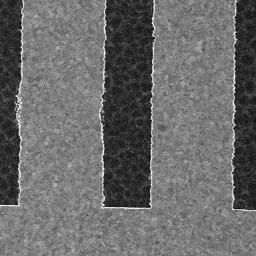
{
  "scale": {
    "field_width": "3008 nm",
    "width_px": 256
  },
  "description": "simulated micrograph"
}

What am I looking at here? one or a few lines or trenches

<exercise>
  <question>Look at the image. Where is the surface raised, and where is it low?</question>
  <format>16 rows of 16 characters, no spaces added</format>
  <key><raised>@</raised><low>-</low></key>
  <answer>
-@@@@@@---@@@@@-
-@@@@@@---@@@@@-
-@@@@@@---@@@@@-
-@@@@@@---@@@@@-
-@@@@@@---@@@@@-
-@@@@@----@@@@@-
-@@@@@---@@@@@@-
-@@@@@---@@@@@@-
-@@@@@---@@@@@@-
-@@@@@---@@@@@@-
-@@@@@---@@@@@@-
-@@@@@---@@@@@@-
-@@@@@---@@@@@@-
@@@@@@@@@@@@@@@@
@@@@@@@@@@@@@@@@
@@@@@@@@@@@@@@@@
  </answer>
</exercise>